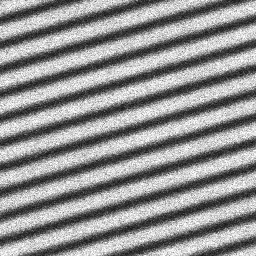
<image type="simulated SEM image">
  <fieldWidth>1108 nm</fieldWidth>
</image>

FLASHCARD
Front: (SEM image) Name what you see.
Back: parallel lines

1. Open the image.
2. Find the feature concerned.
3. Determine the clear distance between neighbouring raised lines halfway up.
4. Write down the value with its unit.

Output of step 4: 49.4 nm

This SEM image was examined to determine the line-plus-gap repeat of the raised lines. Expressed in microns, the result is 0.102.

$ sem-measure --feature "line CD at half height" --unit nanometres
53